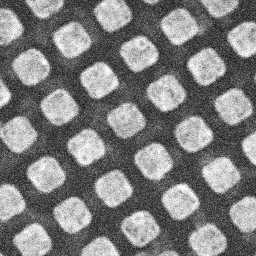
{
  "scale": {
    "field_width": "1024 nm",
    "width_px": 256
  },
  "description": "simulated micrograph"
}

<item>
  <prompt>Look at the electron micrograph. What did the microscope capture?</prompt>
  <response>a regular array of raised bodies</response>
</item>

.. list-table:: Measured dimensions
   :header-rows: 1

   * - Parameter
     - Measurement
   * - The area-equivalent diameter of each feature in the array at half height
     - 128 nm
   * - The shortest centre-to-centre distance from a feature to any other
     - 192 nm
